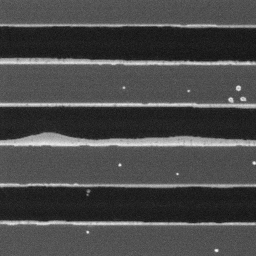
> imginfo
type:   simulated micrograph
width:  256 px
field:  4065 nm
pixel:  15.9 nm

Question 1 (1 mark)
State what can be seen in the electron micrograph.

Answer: lines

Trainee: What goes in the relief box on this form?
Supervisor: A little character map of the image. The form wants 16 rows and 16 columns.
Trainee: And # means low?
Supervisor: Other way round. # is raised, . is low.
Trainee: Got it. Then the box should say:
################
################
................
................
################
################
################
................
................
################
################
################
................
................
################
################